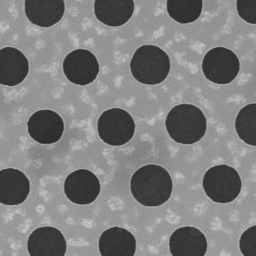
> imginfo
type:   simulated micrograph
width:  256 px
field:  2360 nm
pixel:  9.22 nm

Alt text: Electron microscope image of a regular array of holes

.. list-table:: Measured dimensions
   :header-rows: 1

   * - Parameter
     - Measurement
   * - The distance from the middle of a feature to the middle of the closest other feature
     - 0.632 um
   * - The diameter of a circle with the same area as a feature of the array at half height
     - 347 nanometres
